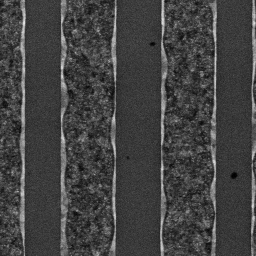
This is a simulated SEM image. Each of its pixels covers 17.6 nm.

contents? wiring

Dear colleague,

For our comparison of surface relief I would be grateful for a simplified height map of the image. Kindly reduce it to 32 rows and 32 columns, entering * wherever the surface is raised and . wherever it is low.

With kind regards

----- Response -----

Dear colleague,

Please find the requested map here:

***.....******......*******.....
***.....******......*******.....
***.....******......*******.....
***.....******......*******.....
***.....******......*******.....
***.....******......*******.....
***.....******......*******.....
***.....******.......******.....
***.....******.......******.....
***.....******......*******.....
***.....******......*******.....
***.....******......*******.....
***.....******......*******.....
***.....******......*******.....
***.....******......*******.....
***.....******......*******.....
***.....******......*******.....
***.....******......*******.....
***.....******......*******.....
***.....******......*******.....
***.....******......*******.....
***.....******......*******.....
***.....******......*******.....
***.....******......*******.....
***.....******......*******.....
***.....******......*******.....
***.....******......*******.....
***.....******......*******.....
***.....******......*******.....
***.....******......*******....*
***.....******......*******....*
***.....******......*******.....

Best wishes